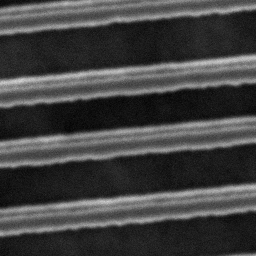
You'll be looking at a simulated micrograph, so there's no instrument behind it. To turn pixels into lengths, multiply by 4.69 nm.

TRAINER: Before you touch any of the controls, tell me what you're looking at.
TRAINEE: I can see lines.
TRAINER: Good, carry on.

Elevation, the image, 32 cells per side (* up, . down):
.......*************************
*****************************...
*****************...............
********........................
................................
................................
................................
.............................***
...................*************
.........***********************
****************************.*..
*******************.............
*********.......................
................................
................................
..........................******
...............*****************
.....***************************
**************************......
**************..................
******..........................
................................
................................
...............................*
....................************
..........**********************
*****************************...
********************............
*********.......................
................................
................................
................................